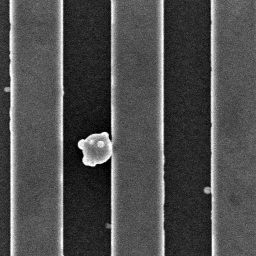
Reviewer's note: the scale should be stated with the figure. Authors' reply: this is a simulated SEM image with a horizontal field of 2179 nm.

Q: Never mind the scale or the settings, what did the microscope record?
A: lines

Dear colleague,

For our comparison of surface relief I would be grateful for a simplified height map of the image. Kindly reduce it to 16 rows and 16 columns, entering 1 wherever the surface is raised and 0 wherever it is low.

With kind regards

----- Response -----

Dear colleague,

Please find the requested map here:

0111000111000111
0111000111000111
0111000111000111
0111000111000111
0111000111000111
0111000111000111
0111000111000111
0111000111000111
0111001111000111
0111011111000111
0111000111000111
0111000111000111
0111000111000111
0111000111000111
0111000111000111
0111000111000111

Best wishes